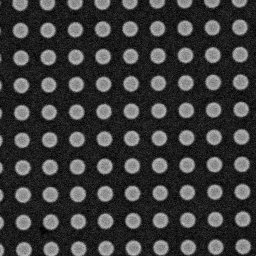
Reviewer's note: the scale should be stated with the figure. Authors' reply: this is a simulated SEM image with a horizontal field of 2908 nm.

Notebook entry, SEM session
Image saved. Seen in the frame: an array of small figures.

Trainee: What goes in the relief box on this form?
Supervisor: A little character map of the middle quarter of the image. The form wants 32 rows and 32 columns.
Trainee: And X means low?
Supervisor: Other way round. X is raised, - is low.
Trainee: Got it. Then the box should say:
--------------------------------
--------------------------------
--------------------------------
--XX-----XX-----XX-----XX----XXX
-XXXX---XXXX---XXX----XXX----XXX
-XXXX---XXXX---XXX----XXX----XXX
--XX-----XX-----XX-----X--------
--------------------------------
--------------------------------
--------------------------------
--XX-----XX-----XX-----XX----XXX
-XXXX---XXXX---XXXX---XXX----XXX
-XXXX---XXXX---XXX----XXX----XXX
--XX-----XX---------------------
--------------------------------
--------------------------------
--------------------------------
--XX-----XX-----XX----XXX----XXX
--XXX---XXXX---XXXX---XXX----XXX
--XXX----XXX---XXXX---XXX----XXX
---X----------------------------
--------------------------------
--------------------------------
--------------------------------
--XXX----XXX----XXX---XXX----XXX
--XXX----XXX---XXXX---XXXX---XXX
--XXX----XXX----XXX---XXX----XXX
--------------------------------
--------------------------------
--------------------------------
------------------------------X-
--XXX----XXX----XXX---XXXX---XXX